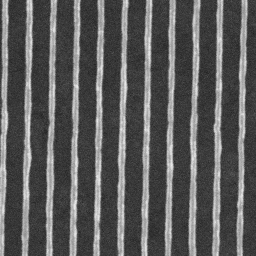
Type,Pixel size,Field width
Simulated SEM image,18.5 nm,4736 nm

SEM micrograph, parallel lines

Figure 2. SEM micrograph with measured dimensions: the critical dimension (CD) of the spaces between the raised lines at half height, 354 nanometers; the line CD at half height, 0.0809 microns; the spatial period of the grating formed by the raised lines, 0.441 micrometres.